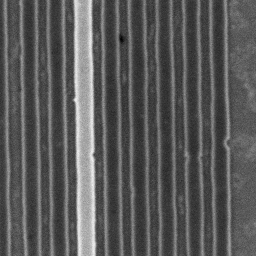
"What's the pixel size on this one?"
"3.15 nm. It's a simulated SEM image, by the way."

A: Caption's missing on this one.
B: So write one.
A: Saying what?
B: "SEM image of parallel lines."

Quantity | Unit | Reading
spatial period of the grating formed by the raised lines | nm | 85.2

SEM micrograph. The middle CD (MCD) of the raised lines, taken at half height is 54.3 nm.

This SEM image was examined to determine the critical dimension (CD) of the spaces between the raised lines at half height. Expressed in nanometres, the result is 33.1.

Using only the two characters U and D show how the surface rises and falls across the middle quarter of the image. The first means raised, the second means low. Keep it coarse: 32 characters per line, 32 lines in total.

DDDUUUUDDDUUUUDDDUUUUDDUUUUDDDUU
DDDUUUUDDDUUUUDDUUUUDDDUUUUDDDUU
DDDUUUUDDDUUUUDDUUUUUDDUUUUDDDUU
DDDUUUUDDDUUUUDDUUUUUDDUUUUDDDUU
DDDUUUUDDDUUUUDDUUUUUDDUUUUDDDUU
DDDUUUUDDDUUUUDDUUUUUDDUUUUDDDUU
DDDUUUUDDDUUUUDDUUUUUDDUUUUDDDUU
DDDUUUUDDDUUUUDDDUUUUDDUUUUDDDUU
DDDUUUUDDDUUUUDDDUUUUDDUUUUDDDUU
DDDUUUUDDDUUUUDDDUUUUDDDUUUDDDUU
DDDUUUUDDDUUUUDDDUUUUDDDUUUDDDUU
DDDUUUUDDDUUUUDDDUUUUDDDUUUDDDUU
DDDUUUUDDDUUUUDDDUUUUDDDUUUDDDUU
DDDUUUUDDDUUUUDDDUUUUDDDUUUDDDUU
DDDUUUUDDDUUUUDDDUUUUDDDUUUDDDUU
DDDUUUUDDDUUUUDDDUUUUDDDUUUDDDUU
DDDUUUUDDDUUUUDDDUUUUDDDUUUDDDUU
DDDUUUUDDDUUUUDDDUUUUDDDUUUDDDUU
DDDUUUUDDDUUUUDDDUUUUDDDUUUDDDUU
DDDUUUUDDDUUUUDDDUUUUDDDUUUUDDUU
DDDUUUUDDDUUUUDDDUUUUDDDUUUUDDUU
DDDUUUUDDDUUUUDDDUUUUDDDUUUUDDUU
DDDUUUUDDDUUUUDDDUUUUDDDUUUUDDUU
DDDUUUUDDDUUUUDDDUUUUDDDUUUUDDDU
DDDUUUUDDDUUUUDDDUUUUDDDUUUUDDUU
UDDUUUUDDDUUUUDDDUUUUDDDUUUUDDUU
UDDUUUUDDDUUUUDDDUUUUDDDUUUUDDUU
UDDUUUUDDDUUUUDDDUUUUDDDUUUUDDDU
UDDUUUUDDDUUUUDDDUUUUDDDUUUUDDDU
UDDUUUUDDDUUUUDDDUUUUDDDUUUUDDDU
UDDUUUUDDDUUUUDDDUUUUDDDUUUUDDDU
UDDUUUUDDDUUUUDDDUUUUDDDUUUUDDDU